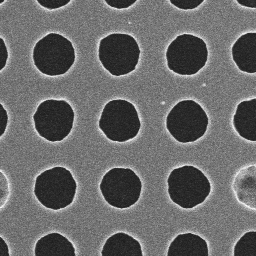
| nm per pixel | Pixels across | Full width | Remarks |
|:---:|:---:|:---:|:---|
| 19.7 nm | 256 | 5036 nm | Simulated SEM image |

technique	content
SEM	a regular array of holes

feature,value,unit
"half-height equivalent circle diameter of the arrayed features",823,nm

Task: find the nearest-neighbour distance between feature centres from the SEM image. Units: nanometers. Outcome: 1280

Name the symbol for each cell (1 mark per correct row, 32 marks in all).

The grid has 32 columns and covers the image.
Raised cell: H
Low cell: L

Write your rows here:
HHHHHLLLHHHHHLLLLHHHHHLLLHHHHHLL
HHHHHHHHHHHHHHHHHHHHHHHHHHHHHHHH
HHHHHHHHHHHHHHHHHHHHHHHHHHHHHHHH
HHHHHHHHHHHHHHHHHHHHHHHHHHHHHHHH
HHHHHHLLHHHHHLLLHHHHHHLLHHHHHHLL
LHHHHLLLLHHHLLLLLHHHHLLLLLHHHLLL
LHHHLLLLLHHHLLLLLHHHHLLLLLHHHLLL
LHHHLLLLLHHHLLLLLHHHHLLLLLHHHLLL
HHHHHLLLLHHHHLLLLHHHHLLLLHHHHHLL
HHHHHHHHHHHHHHHHHHHHHHHHHHHHHHHH
HHHHHHHHHHHHHHHHHHHHHHHHHHHHHHHH
HHHHHHHHHHHHHHHHHHHHHHHHHHHHHHHH
HHHHHHLLHHHHHHLHHHHHHHHHHHHHHHHL
HHHHHLLLLHHHHLLLLHHHHHLLLHHHHHLL
LHHHLLLLLHHHHLLLLHHHHLLLLLHHHLLL
LHHHLLLLLHHHLLLLLLHHHLLLLLHHHLLL
LHHHHLLLLHHHHLLLLHHHHLLLLLHHHHLL
HHHHHHLLHHHHHHLLHHHHHHLLLHHHHHHL
HHHHHHHHHHHHHHHHHHHHHHHHHHHHHHHH
HHHHHHHHHHHHHHHHHHHHHHHHHHHHHHHH
HHHHHHHHHHHHHHHHHHHHHHHHHHHHHHHH
HHHHHLLLLHHHHLLLLHHHHLLLLHHHHHHH
HHHHHLLLLHHHHLLLLHHHHLLLLLHHHHHL
HHHHLLLLLHHHHLLLLLHHHLLLLLHHHHHH
HHHHLLLLLHHHHLLLLHHHHLLLLLHHHHHH
HHHHHLLLLHHHHHLLLHHHHHLLLHHHHHHH
HHHHHHHHHHHHHHHHHHHHHHHHHHHHHHHH
HHHHHHHHHHHHHHHHHHHHHHHHHHHHHHHH
HHHHHHHHHHHHHHHHHHHHHHHHHHHHHHHH
HHHHHHLLHHHHHHLLHHHHHHLLLHHHHHLL
LHHHHLLLLHHHHLLLLHHHHLLLLLHHHLLL
LHHHLLLLLHHHHLLLLLHHHLLLLLHHHLLL